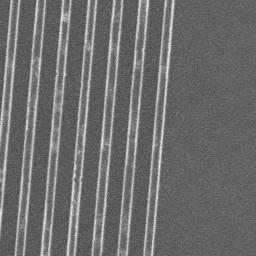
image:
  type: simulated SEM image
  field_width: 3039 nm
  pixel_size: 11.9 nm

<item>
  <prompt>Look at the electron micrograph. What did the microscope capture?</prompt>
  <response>parallel lines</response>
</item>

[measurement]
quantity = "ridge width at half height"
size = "105 nanometres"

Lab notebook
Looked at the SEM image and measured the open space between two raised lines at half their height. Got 201 nm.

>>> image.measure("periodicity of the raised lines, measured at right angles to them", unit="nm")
304